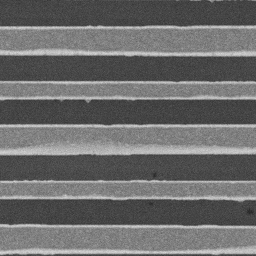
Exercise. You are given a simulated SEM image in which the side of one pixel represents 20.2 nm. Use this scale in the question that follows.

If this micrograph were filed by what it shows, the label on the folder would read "lines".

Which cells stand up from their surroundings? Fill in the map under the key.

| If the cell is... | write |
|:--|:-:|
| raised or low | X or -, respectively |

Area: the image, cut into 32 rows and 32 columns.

--------------------------------
--------------------------------
--------------------------------
XXXXXXXXXXXXXXXXXXXXXXXXXXXXXXXX
XXXXXXXXXXXXXXXXXXXXXXXXXXXXXXXX
XXXXXXXXXXXXXXXXXXXXXXXXXXXXXXXX
XXXXXXXXXXXXXXXXXXXXXXXXXXXXXXXX
--------------------------------
--------------------------------
--------------------------------
XXXXXXXXXXXXXXXXXXXXXXXXXXXXXXXX
XXXXXXXXXXXXXXXXXXXXXXXXXXXXXXXX
--------------------------------
--------------------------------
--------------------------------
--------------------------------
XXXXXXXXXXXXXXXXXXXXXXXXXXXXXXXX
XXXXXXXXXXXXXXXXXXXXXXXXXXXXXXXX
XXXXXXXXXXXXXXXXXXXXXXXXXXXXXXXX
--------------------------------
--------------------------------
--------------------------------
--------------------------------
XXXXXXXXXXXXXXXXXXXXXXXXXXXXXXXX
XXXXXXXXXXXXXXXXXXXXXXXXXXXXXXXX
--------------------------------
--------------------------------
--------------------------------
XXXXXXXXXXXXXXXXXXXXXXXXXXXXXXXX
XXXXXXXXXXXXXXXXXXXXXXXXXXXXXXXX
XXXXXXXXXXXXXXXXXXXXXXXXXXXXXXXX
XXXXXXXXXXXXXXXXXXXXXXXXXXXXXXX-